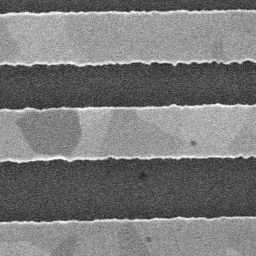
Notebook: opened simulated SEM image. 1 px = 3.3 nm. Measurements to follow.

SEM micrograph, lines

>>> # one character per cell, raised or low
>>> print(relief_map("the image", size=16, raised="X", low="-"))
----------------
XXXXXXXXXXXXXXXX
XXXXXXXXXXXXXXXX
XXXXXXXXXXXXXXXX
----------------
----------------
----------------
XXXXXXXXXXXXXXXX
XXXXXXXXXXXXXXXX
XXXXXXXXXXXXXXXX
----------------
----------------
----------------
----------------
XXXXXXXXXXXXXXXX
XXXXXXXXXXXXXXXX